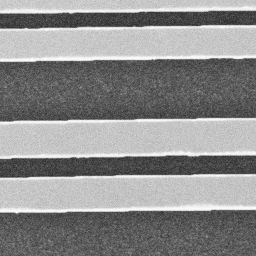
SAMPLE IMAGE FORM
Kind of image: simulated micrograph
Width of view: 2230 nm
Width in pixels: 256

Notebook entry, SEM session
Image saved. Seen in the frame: lines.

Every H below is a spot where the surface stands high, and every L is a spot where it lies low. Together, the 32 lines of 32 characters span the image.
HHHHHHHHHHHHHHHHHHHHHHHHHHHHHHHH
HHLLLLLLLLLLLLLLLLLLLLLLLLLLLLLL
LLLLLLLLLLLLLLLLLLLLLLLLLLLLLLLL
LLLLLLLLLLLHHHHHHHHHHHHHHHHHHHHH
HHHHHHHHHHHHHHHHHHHHHHHHHHHHHHHH
HHHHHHHHHHHHHHHHHHHHHHHHHHHHHHHH
HHHHHHHHHHHHHHHHHHHHHHHHHHHHHHHH
HHHHHHHHHLLLLLLLLLLLLLLLLLLLLLLL
LLLLLLLLLLLLLLLLLLLLLLLLLLLLLLLL
LLLLLLLLLLLLLLLLLLLLLLLLLLLLLLLL
LLLLLLLLLLLLLLLLLLLLLLLLLLLLLLLL
LLLLLLLLLLLLLLLLLLLLLLLLLLLLLLLL
LLLLLLLLLLLLLLLLLLLLLLLLLLLLLLLL
LLLLLLLLLLLLLLLLLLLLLLLLLLLLLLLL
LLLLLLLLLLLLLLLLLLLLLLLLLLLLLLLL
HHHHHHHHHHHHHHHHHHHHHHHHHHHHHHHH
HHHHHHHHHHHHHHHHHHHHHHHHHHHHHHHH
HHHHHHHHHHHHHHHHHHHHHHHHHHHHHHHH
HHHHHHHHHHHHHHHHHHHHHHHHHHHHHHHH
HHHHHHHHHHHHHHHLLLLLLLLLLLLLLLLL
LLLLLLLLLLLLLLLLLLLLLLLLLLLLLLLL
LLLLLLLLLLLLLLLLLLLLLLLLLLLLLLLL
HHHHHHHHHHHHHHHHHHHHHHHHHHHHHHHH
HHHHHHHHHHHHHHHHHHHHHHHHHHHHHHHH
HHHHHHHHHHHHHHHHHHHHHHHHHHHHHHHH
HHHHHHHHHHHHHHHHHHHHHHHHHHHHHHHH
LLLLLLLLLLLLLLLLLLLLLLLLLLLLLLLL
LLLLLLLLLLLLLLLLLLLLLLLLLLLLLLLL
LLLLLLLLLLLLLLLLLLLLLLLLLLLLLLLL
LLLLLLLLLLLLLLLLLLLLLLLLLLLLLLLL
LLLLLLLLLLLLLLLLLLLLLLLLLLLLLLLL
LLLLLLLLLLLLLLLLLLLLLLLLLLLLLLLL